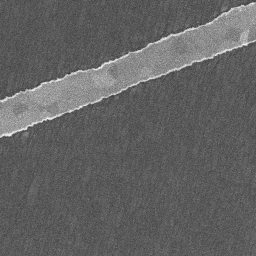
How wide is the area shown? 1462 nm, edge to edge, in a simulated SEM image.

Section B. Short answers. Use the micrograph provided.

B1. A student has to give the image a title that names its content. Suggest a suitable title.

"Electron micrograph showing one or a few lines or trenches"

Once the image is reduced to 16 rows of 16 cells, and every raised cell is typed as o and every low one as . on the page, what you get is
...............o
.............ooo
..........oooooo
........ooooo...
.....oooooo.....
..oooooo........
oooooo..........
ooo.............
................
................
................
................
................
................
................
................